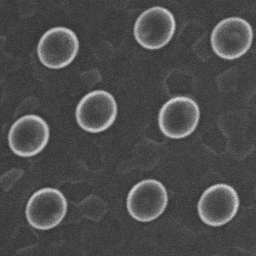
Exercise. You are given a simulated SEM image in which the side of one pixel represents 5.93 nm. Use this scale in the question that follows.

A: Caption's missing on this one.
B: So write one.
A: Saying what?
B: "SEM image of a regular array of raised bodies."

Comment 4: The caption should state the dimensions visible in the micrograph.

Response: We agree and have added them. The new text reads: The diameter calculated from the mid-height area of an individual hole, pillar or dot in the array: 232 nanometers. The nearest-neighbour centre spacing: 442 nanometers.